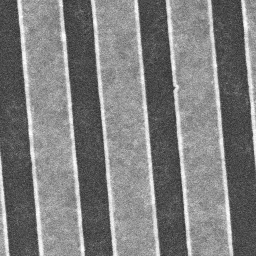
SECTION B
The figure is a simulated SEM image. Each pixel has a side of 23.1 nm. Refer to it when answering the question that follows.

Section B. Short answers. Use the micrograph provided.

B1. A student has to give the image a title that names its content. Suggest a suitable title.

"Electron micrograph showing one or a few lines or trenches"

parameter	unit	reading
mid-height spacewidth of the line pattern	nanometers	723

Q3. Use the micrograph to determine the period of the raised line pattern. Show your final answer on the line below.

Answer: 1.71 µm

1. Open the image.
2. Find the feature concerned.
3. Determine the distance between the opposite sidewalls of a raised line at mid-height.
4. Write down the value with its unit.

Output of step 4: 0.977 microns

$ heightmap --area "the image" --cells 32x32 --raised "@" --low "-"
--@@@@@@----@@@@@----@@@@@----@@
--@@@@@@----@@@@@----@@@@@-----@
---@@@@@----@@@@@----@@@@@-----@
---@@@@@----@@@@@----@@@@@@----@
---@@@@@----@@@@@----@@@@@@----@
---@@@@@----@@@@@----@@@@@@----@
---@@@@@----@@@@@@----@@@@@----@
---@@@@@----@@@@@@----@@@@@----@
---@@@@@----@@@@@@----@@@@@----@
---@@@@@----@@@@@@----@@@@@----@
---@@@@@@---@@@@@@----@@@@@----@
---@@@@@@----@@@@@----@@@@@----@
----@@@@@----@@@@@----@@@@@----@
---@@@@@@----@@@@@----@@@@@-----
----@@@@@----@@@@@----@@@@@-----
----@@@@@----@@@@@----@@@@@@----
----@@@@@----@@@@@----@@@@@@----
----@@@@@----@@@@@@---@@@@@@----
----@@@@@----@@@@@@----@@@@@----
----@@@@@----@@@@@@----@@@@@----
----@@@@@----@@@@@@----@@@@@----
----@@@@@----@@@@@@----@@@@@----
----@@@@@@---@@@@@@----@@@@@----
----@@@@@@----@@@@@----@@@@@----
-----@@@@@----@@@@@----@@@@@----
-----@@@@@----@@@@@----@@@@@----
@----@@@@@----@@@@@----@@@@@@---
@----@@@@@----@@@@@----@@@@@@---
@----@@@@@----@@@@@----@@@@@@---
@----@@@@@----@@@@@@---@@@@@@---
@----@@@@@----@@@@@@----@@@@@---
@----@@@@@----@@@@@@----@@@@@---